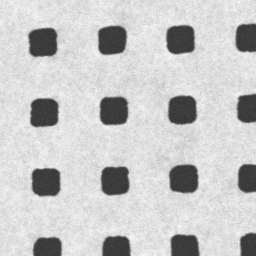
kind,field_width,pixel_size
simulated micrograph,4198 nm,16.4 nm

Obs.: a regular array of holes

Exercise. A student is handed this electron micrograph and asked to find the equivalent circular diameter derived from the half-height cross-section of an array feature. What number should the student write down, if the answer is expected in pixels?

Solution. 30.7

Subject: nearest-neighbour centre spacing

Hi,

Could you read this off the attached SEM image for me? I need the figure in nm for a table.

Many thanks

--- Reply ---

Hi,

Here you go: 1130